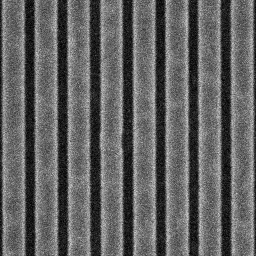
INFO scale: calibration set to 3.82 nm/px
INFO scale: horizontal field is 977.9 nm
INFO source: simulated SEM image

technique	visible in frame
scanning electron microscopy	parallel lines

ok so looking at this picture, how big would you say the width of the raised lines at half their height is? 21.1 pixels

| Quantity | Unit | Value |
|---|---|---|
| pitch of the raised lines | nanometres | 125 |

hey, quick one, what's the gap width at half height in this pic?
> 42 nm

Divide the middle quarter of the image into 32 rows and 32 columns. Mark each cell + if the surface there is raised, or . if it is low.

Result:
.+++++...+++++....+++++...+++++.
.+++++...+++++....+++++...+++++.
.+++++...+++++....+++++...+++++.
.+++++...+++++....+++++...+++++.
.+++++...+++++....+++++...+++++.
.+++++...+++++....+++++...+++++.
.+++++...+++++....+++++...+++++.
.+++++...+++++....+++++...+++++.
.+++++...+++++....+++++...+++++.
.+++++...+++++...++++++...+++++.
.+++++....++++....+++++...+++++.
.+++++...+++++....+++++...+++++.
.+++++...+++++....+++++...+++++.
.+++++...+++++....+++++...+++++.
.+++++...+++++...++++++...+++++.
.+++++...+++++....+++++...+++++.
.+++++...+++++....+++++...+++++.
.+++++...+++++....+++++...+++++.
.+++++...+++++....+++++...+++++.
.+++++...+++++....+++++...+++++.
.+++++...+++++....+++++...+++++.
.+++++...+++++....+++++...+++++.
.+++++...+++++....+++++...+++++.
.+++++...+++++....+++++...+++++.
.+++++...+++++....+++++...+++++.
.+++++...+++++....+++++...+++++.
.+++++...+++++....+++++...+++++.
.+++++...+++++....+++++...+++++.
.+++++...+++++....+++++...+++++.
.+++++...+++++....+++++...+++++.
.+++++...+++++....+++++...+++++.
.+++++...+++++....+++++...+++++.